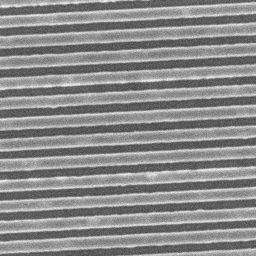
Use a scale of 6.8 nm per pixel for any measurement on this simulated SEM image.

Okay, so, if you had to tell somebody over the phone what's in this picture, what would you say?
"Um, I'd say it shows parallel lines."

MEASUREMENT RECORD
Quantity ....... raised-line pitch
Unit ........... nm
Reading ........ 139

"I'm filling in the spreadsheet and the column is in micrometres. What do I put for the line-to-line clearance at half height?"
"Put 0.0611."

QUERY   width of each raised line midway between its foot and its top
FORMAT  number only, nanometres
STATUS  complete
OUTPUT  74.7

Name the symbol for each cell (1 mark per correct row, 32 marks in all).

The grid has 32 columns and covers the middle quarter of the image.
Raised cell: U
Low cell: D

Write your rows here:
DDDDDDDDDDDDDDDDDDDDDDDDDDDDDDDD
DDDDDDDDDDDDDDDDDDDDDDDDDUUUUUUU
DDDDDDUUUUUUUUUUUUUUUUUUUUUUUUUU
UUUUUUUUUUUUUUUUUUUUUUUUUUUUUUUU
UUUUUUUUUUUUUUUUDDDDDDDDDDDDDDDD
DDDDDDDDDDDDDDDDDDDDDDDDDDDDDDDD
DDDDDDDDDDDDDDDDDDDDDDDDDUUUUUUU
DDDDDDUUUUUUUUUUUUUUUUUUUUUUUUUU
UUUUUUUUUUUUUUUUUUUUUUUUUUUUUUUU
UUUUUUUUUUUUUUUUDDDDDDDDDDDDDDDD
DDDDDDDDDDDDDDDDDDDDDDDDDDDDDDDD
DDDDDDDDDDDDDDDDDDDDDDDDDDUDDUUU
DDDDDDDDDDDUUUUUUUUUUUUUUUUUUUUU
UUUUUUUUUUUUUUUUUUUUUUUUUUUUUUUU
UUUUUUUUUUUUUUUUUUUUUDDDDDDDDDDD
UUUDDDDDDDDDDDDDDDDDDDDDDDDDDDDD
DDDDDDDDDDDDDDDDDDDDDDDDDDDDDDUU
DDDDDDDDDDDUUUUUUUUUUUUUUUUUUUUU
UUUUUUUUUUUUUUUUUUUUUUUUUUUUUUUU
UUUUUUUUUUUUUUUUUUUUUDDDDDDDDDDD
UUUDDDDDDDDDDDDDDDDDDDDDDDDDDDDD
DDDDDDDDDDDDDDDDDDDDDDDDDDDDDDUU
DDDDDDDDDDDDDUDUUUUUUUUUUUUUUUUU
UUUUUUUUUUUUUUUUUUUUUUUUUUUUUUUU
UUUUUUUUUUUUUUUUUUUUUUUUUUUDDDDD
UUUUUUUDDDDDDDDDDDDDDDDDDDDDDDDD
DDDDDDDDDDDDDDDDDDDDDDDDDDDDDDDD
DDDDDDDDDDDDDDDDUUUUUUUUUUUUUUUU
UUUUUUUUUUUUUUUUUUUUUUUUUUUUUUUU
UUUUUUUUUUUUUUUUUUUUUUUUUUDDDDDD
UUUUUUUUDDDDDDDDDDDDDDDDDDDDDDDD
DDDDDDDDDDDDDDDDDDDDDDDDDDDDDDDD